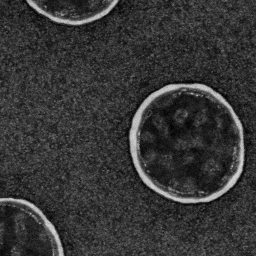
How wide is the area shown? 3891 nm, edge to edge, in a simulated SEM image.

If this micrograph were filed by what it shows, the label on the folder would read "raised bodies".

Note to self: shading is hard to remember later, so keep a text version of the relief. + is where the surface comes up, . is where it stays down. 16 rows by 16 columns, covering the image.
..+++++.........
................
................
................
................
...........++...
.........+++++..
.........++++++.
........+++++++.
........+++++++.
.........++++++.
.........+++++..
+...............
+++.............
+++.............
++++............